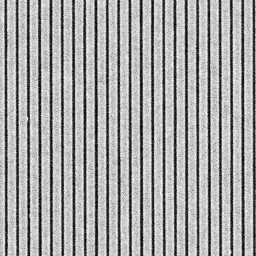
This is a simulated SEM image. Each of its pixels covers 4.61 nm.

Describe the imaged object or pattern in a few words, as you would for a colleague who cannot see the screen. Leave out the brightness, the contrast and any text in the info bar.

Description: parallel lines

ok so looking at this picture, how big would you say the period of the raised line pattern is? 52 nanometers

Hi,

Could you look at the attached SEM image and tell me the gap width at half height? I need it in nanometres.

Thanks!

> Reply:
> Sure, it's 15.6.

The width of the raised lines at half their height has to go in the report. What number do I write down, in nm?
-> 35.1